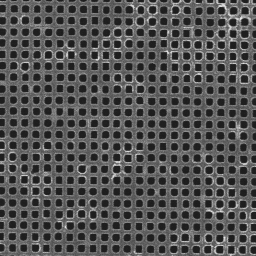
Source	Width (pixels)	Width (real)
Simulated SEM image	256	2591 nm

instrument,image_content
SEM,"a regular array of holes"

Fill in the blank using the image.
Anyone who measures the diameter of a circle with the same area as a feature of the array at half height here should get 80.8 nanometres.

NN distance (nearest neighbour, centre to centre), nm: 112